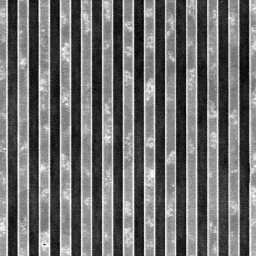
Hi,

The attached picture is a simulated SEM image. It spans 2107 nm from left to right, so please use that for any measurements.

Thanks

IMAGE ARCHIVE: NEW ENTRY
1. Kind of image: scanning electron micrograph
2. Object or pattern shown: parallel lines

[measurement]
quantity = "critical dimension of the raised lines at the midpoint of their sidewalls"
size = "84.4 nanometres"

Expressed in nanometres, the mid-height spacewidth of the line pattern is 90.6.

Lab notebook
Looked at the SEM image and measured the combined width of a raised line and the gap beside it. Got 174 nm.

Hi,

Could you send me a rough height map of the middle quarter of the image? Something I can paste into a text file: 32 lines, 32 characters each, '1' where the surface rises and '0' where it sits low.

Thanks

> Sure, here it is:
11000110001100011000111000110001
11000110001100011000111000110001
11000110001100011000111000110001
11000110001100011000111000110001
11000110001100011000111000110001
11000110001100011000111000110001
11000110001100011000111000110001
11000110001100011000111000110001
11000110001100011000111000110001
11000110001100011000111000110001
11000110001100011000111000110001
11000110001100011000111000110001
11000110001100011000111000110001
11000110001100011000111000110001
11000110001100011000111000110001
11000110001100011000111000110001
11000110001100011000111000110001
11000110001100011000111000110001
11000110001100011000111000110001
11000110001100011000111000110001
11000110001100011000111000110001
11000110001100011000111000110001
11000110001100011000111000110001
11000110001100011000111000110001
11000110001100011000111000110001
11000110001100011000111000110001
11000110001100011000111000110001
11000110001100011000111000110001
11001110001100011000111000110001
11001110001100011000111000110001
11001110001100011000111000110001
11000110001100011000111000110001